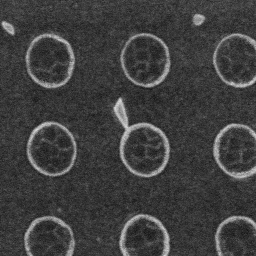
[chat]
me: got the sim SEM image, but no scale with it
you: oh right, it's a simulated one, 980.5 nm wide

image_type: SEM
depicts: raised bodies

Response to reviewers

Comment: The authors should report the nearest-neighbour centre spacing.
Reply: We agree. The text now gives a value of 341 nanometers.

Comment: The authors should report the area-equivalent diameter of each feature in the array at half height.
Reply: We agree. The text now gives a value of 192 nm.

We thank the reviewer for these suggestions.